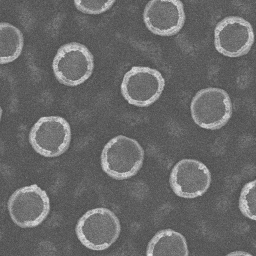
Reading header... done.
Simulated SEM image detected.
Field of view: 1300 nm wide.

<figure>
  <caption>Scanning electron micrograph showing a regular array of raised bodies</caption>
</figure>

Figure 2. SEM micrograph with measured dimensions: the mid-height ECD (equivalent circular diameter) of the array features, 205 nanometers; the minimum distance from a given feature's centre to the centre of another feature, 368 nanometers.